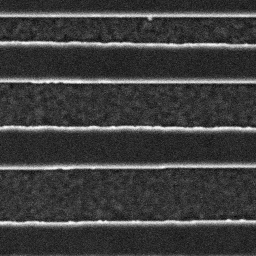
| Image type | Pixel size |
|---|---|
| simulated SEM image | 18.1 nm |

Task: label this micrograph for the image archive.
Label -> lines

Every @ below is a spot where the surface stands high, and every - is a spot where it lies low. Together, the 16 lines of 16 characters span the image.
@@@@@@@@@@@@@@@@
----------------
----------------
@@@@@@@@@@@@@@@@
@@@@@@@@@@@@@@@@
----------------
----------------
----------------
@@@@@@@@@@@@@@@@
@@@@@@@@@@@@@@@@
@@@@@-----------
----------------
----------------
----------------
@@@@@@@@@@@@@@@@
@@@@@@@@@@@@@@@@